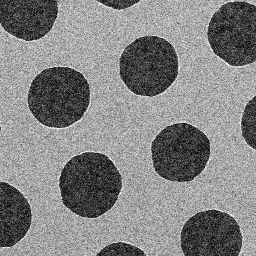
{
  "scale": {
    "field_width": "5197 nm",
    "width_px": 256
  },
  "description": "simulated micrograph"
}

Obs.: raised bodies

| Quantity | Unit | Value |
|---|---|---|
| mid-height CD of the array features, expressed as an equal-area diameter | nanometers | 1260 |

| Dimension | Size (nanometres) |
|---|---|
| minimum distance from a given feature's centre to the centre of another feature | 1880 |